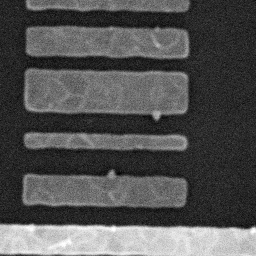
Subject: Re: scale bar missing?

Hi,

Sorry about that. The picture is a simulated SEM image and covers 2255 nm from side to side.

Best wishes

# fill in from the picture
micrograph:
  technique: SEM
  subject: groups of lines, slits or small figures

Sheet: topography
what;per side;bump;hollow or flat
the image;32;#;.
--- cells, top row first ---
...#####################........
................................
................................
....######...##.................
...####################.........
...####################.........
...####################.........
................................
................................
...####################.........
...####################.........
...####################.........
...####################.........
....###################.........
...................#............
................................
................................
...####################.........
.............####.#####.........
................................
................................
................................
...####################.........
...####################.........
...####################.........
......#################.........
................................
................................
##########.##.#.##....#.........
################################
################################
################################